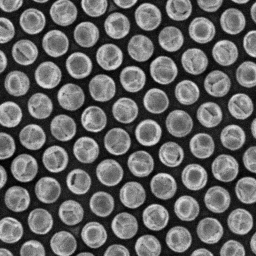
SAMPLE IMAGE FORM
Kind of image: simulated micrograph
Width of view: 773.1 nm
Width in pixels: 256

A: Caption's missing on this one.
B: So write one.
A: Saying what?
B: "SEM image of a regular array of raised bodies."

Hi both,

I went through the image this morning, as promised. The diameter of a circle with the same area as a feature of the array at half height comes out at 76.4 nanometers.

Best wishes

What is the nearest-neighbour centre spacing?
96.1 nm